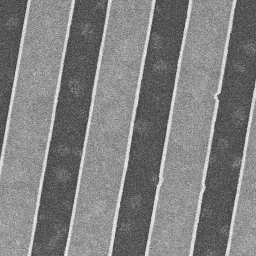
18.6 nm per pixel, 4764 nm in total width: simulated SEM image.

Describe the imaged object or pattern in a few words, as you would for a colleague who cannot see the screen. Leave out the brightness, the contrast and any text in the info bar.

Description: one or a few lines or trenches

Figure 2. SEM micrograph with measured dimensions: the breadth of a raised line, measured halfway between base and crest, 44.2 px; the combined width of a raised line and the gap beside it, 1.48 µm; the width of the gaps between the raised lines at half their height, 665 nanometres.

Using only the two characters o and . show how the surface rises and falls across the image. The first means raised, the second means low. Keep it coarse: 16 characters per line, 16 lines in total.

..ooo..ooo..ooo.
..oo...oo...oo..
.ooo..ooo..ooo..
.ooo..ooo..ooo..
.ooo..ooo..ooo..
.ooo..ooo..ooo..
.oo...oo...ooo..
.oo...oo...oo...
ooo..ooo..ooo..o
ooo..ooo..ooo..o
ooo..ooo..ooo..o
ooo..ooo..ooo..o
oo...oo...ooo..o
oo...oo...oo...o
oo..ooo..ooo..oo
oo..ooo..ooo..oo